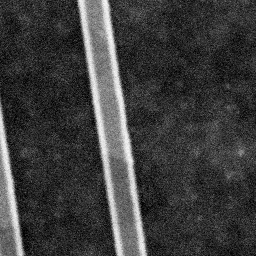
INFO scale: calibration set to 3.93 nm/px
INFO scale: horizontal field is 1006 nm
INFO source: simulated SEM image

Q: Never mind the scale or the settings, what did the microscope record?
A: one or a few lines or trenches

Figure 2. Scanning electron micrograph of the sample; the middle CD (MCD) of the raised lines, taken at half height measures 94.1 nanometres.